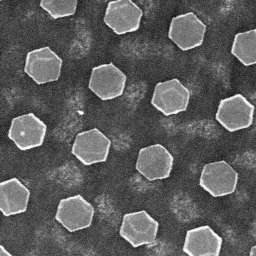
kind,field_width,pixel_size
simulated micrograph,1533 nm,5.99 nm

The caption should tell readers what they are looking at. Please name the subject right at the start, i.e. a regular array of raised bodies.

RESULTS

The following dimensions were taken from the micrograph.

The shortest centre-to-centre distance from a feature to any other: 395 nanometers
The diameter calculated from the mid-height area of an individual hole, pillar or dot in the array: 35.2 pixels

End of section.